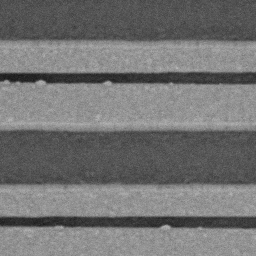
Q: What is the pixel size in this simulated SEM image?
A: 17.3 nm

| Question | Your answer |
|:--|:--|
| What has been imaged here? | lines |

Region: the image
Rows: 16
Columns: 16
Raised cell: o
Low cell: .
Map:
................
................
................
oooooooooooooooo
oooooooooooooooo
oooooooooooooooo
oooooooooooooooo
oooooooooooooooo
................
................
................
................
oooooooooooooooo
oooooooooooooooo
oooooooooooooooo
oooooooooooooooo